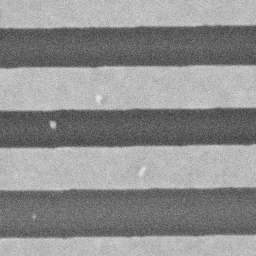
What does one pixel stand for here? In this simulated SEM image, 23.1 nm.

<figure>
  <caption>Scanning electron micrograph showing lines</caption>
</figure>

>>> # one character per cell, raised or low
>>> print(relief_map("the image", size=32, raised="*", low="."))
********************************
********************************
********************************
*...............................
................................
................................
................................
................................
............********************
********************************
********************************
********************************
********************************
*****************...............
................................
................................
................................
................................
..............******************
********************************
********************************
********************************
********************************
*******************.............
................................
................................
................................
................................
................................
................................
********************************
********************************